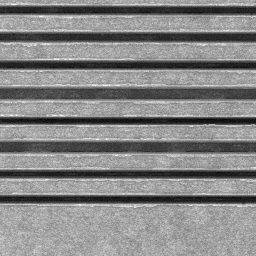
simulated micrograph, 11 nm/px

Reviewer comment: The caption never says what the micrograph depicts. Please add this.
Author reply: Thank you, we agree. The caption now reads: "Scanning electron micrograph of parallel lines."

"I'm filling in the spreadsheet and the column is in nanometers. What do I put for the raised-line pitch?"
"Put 300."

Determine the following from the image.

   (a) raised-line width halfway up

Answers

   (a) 202 nm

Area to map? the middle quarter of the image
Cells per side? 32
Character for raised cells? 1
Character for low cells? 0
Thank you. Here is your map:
00000000000000000000000000000000
11110000011111011111101101111010
11111111111111111111111111111111
11111111111111111111111111111111
11111111111111111111111111111111
11111111111111111111111111111111
00000000000000000000000000000000
00000000000000000000000000000000
00000000000000000000000000000000
11111111111111111111111111111111
11111111111111111111111111111111
11111111111111111111111111111111
11111111111111111111111111111111
00000000000000000000000000000000
00000000000000000000000000000000
11111111111111111111111111111111
11111111111111111111111111111111
11111111111111111111111111111111
11111111111111111111111111111111
00000000000000000000000000000000
00000000000000000000000000000000
00000000000000000000000000000000
11111111111111111111111111111111
11111111111111111111111111111111
11111111111111111111111111111111
11111111111111111111111111111111
00000000000000000000000000000000
00000000000000000000000000000000
00000000000000000000000000000000
11111111111111111111111111111111
11111111111111111111111111111111
11111111111111111111111111111111